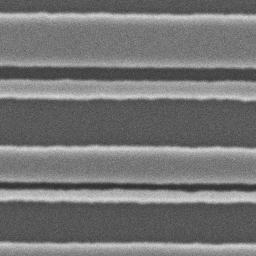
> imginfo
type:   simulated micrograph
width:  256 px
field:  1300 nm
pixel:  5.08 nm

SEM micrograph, lines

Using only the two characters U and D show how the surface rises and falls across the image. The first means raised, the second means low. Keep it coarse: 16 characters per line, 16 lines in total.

DDDDDDDDDDDDDDDD
UUUUUUUUUUUUUUUU
UUUUUUUUUUUUUUUU
UUUUUUUUUUUUUUUU
UUUUUUUUUUUUUUUU
UUUUUUUUUUUUUUUU
DDDDDDDDDDDDDDDD
DDDDDDDDDDDDDDDD
DDDDDDDDDDDDDDDD
UUUUUUUUUUUUUUUU
UUUUUUUUUUUUUUUU
UUUUUUUUUUUUUUUU
DDUUUUUUUUUUUUUU
DDDDDDDDDDDDDDDD
DDDDDDDDDDDDDDDD
UUUUUUUUUUUUUUUU